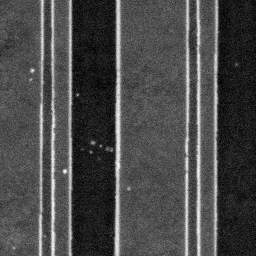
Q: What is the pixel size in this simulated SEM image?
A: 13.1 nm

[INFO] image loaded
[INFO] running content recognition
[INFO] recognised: lines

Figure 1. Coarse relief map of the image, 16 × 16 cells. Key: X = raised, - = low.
XXXX---XXXXXX---
XXXX---XXXXXX---
XXXX---XXXXXX---
XXXX---XXXXXX---
XXXX---XXXXXX---
XXXX---XXXXXX---
XXXX---XXXXXX---
XXXX---XXXXXX---
XXXX---XXXXXX---
XXXX---XXXXXX---
XXXX---XXXXXX---
XXXX---XXXXXX---
XXXX---XXXXXX---
XXXX---XXXXXX---
XXXX---XXXXXX---
XXXX---XXXXXX---